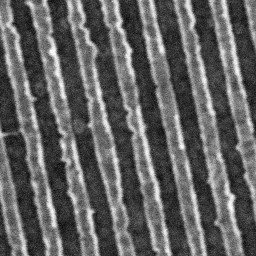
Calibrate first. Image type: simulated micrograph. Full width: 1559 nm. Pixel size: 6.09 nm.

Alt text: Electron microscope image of parallel lines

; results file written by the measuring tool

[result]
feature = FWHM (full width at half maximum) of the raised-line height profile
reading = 0.0901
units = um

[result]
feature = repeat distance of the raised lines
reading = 214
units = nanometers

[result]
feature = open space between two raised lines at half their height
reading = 126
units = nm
